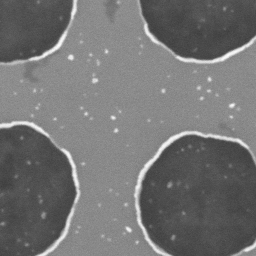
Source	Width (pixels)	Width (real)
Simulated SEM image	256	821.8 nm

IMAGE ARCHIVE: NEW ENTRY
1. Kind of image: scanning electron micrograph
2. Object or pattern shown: holes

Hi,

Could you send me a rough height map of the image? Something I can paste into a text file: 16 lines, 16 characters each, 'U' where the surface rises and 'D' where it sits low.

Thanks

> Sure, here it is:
DDDDDUUUUDDDDDDD
DDDDUUUUUDDDDDDD
DDDDUUUUUUDDDDDD
DDUUUUUUUUUDDDUU
UUUUUUUUUUUUUUUU
UUUUUUUUUUUUUUUU
UUUUUUUUUUUUUUUU
UUUUUUUUUUUUUUUU
DDDUUUUUUUUDUUUU
DDDDUUUUUUDDDDDD
DDDDUUUUUDDDDDDD
DDDDDUUUUDDDDDDD
DDDDDUUUUDDDDDDD
DDDDUUUUUDDDDDDD
DDDDUUUUUDDDDDDD
DDDUUUUUUUDDDDDU